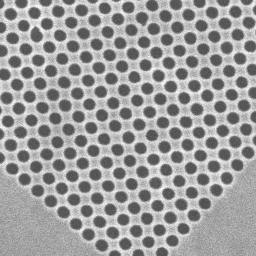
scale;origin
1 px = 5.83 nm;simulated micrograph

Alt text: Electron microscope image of a regular array of holes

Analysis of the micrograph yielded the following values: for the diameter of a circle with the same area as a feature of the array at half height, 11.7 pixels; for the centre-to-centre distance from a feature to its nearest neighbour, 0.0949 microns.